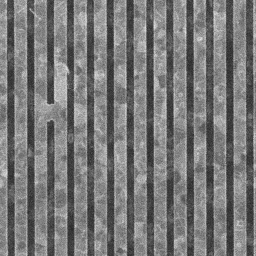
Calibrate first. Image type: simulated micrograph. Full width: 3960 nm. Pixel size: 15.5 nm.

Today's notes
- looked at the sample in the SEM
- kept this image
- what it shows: parallel lines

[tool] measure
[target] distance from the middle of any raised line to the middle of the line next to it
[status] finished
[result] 308 nm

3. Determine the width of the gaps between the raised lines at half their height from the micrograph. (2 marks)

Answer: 122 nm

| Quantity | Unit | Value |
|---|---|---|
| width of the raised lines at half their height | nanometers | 182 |